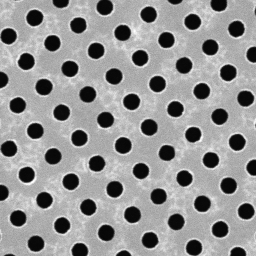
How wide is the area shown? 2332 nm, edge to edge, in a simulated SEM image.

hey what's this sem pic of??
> a regular array of holes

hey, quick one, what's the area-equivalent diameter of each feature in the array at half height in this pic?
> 152 nm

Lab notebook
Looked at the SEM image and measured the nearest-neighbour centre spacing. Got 282 nanometers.